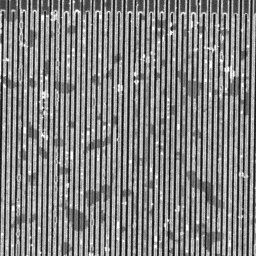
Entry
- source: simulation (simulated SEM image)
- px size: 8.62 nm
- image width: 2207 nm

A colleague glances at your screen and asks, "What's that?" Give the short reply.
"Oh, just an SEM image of parallel lines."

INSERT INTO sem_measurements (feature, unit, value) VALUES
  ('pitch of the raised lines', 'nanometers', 45.6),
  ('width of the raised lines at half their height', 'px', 2.88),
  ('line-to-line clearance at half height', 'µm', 0.0237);